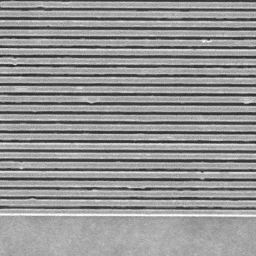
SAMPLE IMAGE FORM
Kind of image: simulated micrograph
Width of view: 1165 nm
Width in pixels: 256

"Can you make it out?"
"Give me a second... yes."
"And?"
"parallel lines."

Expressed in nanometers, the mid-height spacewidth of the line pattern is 13.7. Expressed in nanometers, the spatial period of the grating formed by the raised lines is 42.9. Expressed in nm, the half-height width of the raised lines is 26.7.